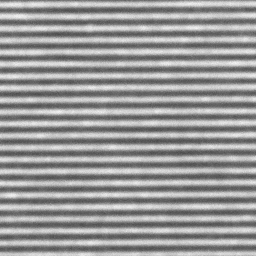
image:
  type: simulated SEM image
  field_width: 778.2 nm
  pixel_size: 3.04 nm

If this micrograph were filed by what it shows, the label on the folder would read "parallel lines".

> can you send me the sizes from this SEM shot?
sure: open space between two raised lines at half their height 7.14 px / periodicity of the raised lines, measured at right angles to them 36.2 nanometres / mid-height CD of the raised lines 13.7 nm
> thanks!